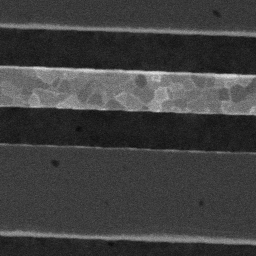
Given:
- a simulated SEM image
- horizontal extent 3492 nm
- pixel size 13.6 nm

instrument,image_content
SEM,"lines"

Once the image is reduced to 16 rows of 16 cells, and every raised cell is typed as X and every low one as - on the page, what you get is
XXXXXXXXXXXXXXXX
XXXXXXXXXXXXXXXX
----------------
----------------
XXXXXXXXXXX-----
XXXXXXXXXXXXXXXX
XXXXXXXXXXXXXXXX
----------------
----------------
XXXXXXXXXXXXX---
XXXXXXXXXXXXXXXX
XXXXXXXXXXXXXXXX
XXXXXXXXXXXXXXXX
XXXXXXXXXXXXXXXX
XXXXXXXXXXXXXXXX
----------------